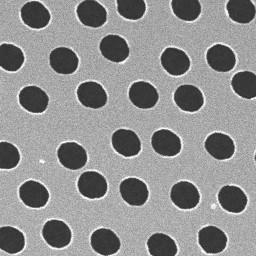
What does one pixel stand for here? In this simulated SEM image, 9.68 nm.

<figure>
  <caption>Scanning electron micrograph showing a regular array of holes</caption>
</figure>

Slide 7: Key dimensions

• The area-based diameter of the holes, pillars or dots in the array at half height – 28.8 pixels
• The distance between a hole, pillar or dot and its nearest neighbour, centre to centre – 0.442 micrometres